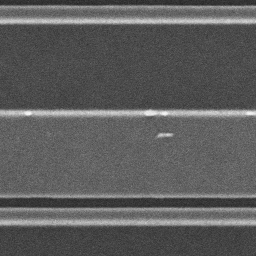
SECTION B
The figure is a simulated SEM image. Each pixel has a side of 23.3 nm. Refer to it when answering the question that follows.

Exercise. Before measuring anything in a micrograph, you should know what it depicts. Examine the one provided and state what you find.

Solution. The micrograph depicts lines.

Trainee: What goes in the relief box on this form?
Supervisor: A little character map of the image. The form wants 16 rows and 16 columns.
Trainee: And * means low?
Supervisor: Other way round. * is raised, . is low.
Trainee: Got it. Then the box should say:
****************
................
................
................
................
................
................
****************
****************
****************
****************
****************
****************
****************
................
................